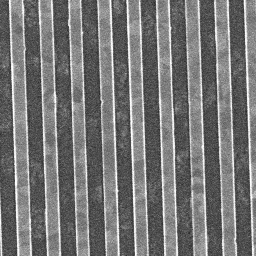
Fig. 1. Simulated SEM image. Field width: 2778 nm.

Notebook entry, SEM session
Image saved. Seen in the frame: parallel lines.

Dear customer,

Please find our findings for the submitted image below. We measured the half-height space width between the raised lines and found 17.1 px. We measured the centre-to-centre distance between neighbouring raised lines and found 0.318 micrometres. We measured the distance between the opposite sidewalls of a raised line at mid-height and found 140 nm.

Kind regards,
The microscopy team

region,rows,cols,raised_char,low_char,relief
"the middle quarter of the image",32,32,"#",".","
..###....###....###.....###....#
..###....###.....##.....###....#
..###....###.....##.....###....#
..###....###.....##.....###....#
..###....###.....##.....###....#
..###....###.....##.....###....#
..###....###.....##.....###....#
..###....###.....##.....###....#
..###....###.....###....###....#
..###.....##.....###....###....#
..###....###.....###....###....#
..###....###.....###....###....#
..###....###.....###....###....#
..###....###.....###....###....#
..###....###.....###....###.....
..###....###.....###....###.....
..###.....###....###....###.....
..###.....###....###....###.....
..###.....###....###....###.....
..###.....###....###....###.....
...##.....###....###....###.....
...##.....###....###....###.....
...##.....###....###.....##.....
...##.....###....###.....###....
...##.....###....###.....###....
...###....###....###.....###....
...###....###....###.....###....
...###....###....###.....###....
...###....###....###.....###....
...###....###....###.....###....
...###....###....###.....###....
...###....###.....##.....###....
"